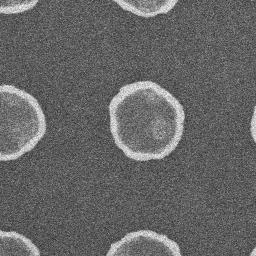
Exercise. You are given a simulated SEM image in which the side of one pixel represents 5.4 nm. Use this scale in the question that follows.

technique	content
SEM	raised bodies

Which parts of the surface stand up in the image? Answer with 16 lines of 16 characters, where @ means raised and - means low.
@-------@@------
----------------
----------------
----------------
----------------
--------@@------
@@-----@@@@-----
@@@----@@@@-----
@@-----@@@@-----
@-------@@------
----------------
----------------
----------------
----------------
----------------
@@-----@@@@-----